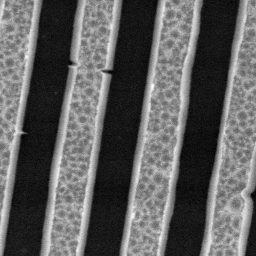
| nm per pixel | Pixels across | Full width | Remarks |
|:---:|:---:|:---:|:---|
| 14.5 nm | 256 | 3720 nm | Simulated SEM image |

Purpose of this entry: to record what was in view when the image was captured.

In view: one or a few lines or trenches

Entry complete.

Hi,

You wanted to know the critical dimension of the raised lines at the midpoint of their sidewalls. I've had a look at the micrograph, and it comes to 553 nanometres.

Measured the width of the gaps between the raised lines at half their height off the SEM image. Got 602 nm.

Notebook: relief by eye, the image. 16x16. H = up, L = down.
HHLLLHHLLLHHLLLH
HHLLLHHLLLHHLLLH
HHLLLHHLLLHHLLLH
HHLLLHHLLLHHLLLH
HHLLLHHLLHHHLLHH
HHLLHHHLLHHHLLHH
HLLLHHLLLHHHLLHH
HLLLHHLLLHHLLLHH
HLLLHHLLLHHLLLHH
HLLLHHLLLHHLLLHH
HLLHHHLLHHHLLHHH
HLLHHHLLHHHLLHHH
HLLHHHLLHHHLLHHH
LLLHHLLLHHLLLHHH
LLLHHLLLHHLLLHHL
LLLHHLLLHHLLLHHL